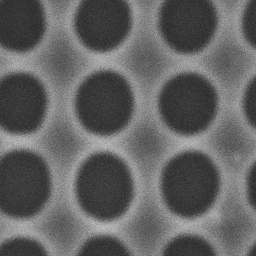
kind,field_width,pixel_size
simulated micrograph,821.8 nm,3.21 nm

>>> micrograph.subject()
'holes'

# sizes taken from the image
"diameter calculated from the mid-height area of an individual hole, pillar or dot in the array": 212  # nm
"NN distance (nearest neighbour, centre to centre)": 81.8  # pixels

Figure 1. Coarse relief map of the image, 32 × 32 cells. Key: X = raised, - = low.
-----XXXXX------XXXX-------XXXX-
------XXX--------XXX-------XXX--
------XXX--------XXX-------XXX--
------XXX--------XXX-------XXX--
------XXX-------XXXX-------XXX--
-----XXXXX-----XXXXXX-----XXXXX-
X---XXXXXXX---XXXXXXXX---XXXXXXX
XXXXXXXXXXXXXXXXXXXXXXXXXXXXXXXX
XXXXXXXXXXXXX-XXXXXXXXXXXXXXXXXX
-----XXXXXX-----XXXXX-----XXXXXX
------XXXX------XXXX-------XXXX-
------XXX--------XXX-------XXX--
------XXX--------XXX-------XXX--
------XXX--------XXX-------XXX--
------XXX--------XXX-------XXX--
-----XXXXX------XXXX------XXXXX-
-----XXXXXX----XXXXXX-----XXXXXX
XXXXXXXXXXXXXXXXXXXXXXXXXXXXXXXX
XX-XXXXXXXXXXXXXXXXXXXXXXXXXXXXX
-----XXXXXX----XXXXXXX----XXXXXX
------XXXX------XXXXX------XXXXX
------XXX--------XXX--------XXX-
-------XX--------XXX--------XXX-
-------XX--------XXX--------XXX-
------XXX--------XXX-------XXXX-
------XXXX-------XXXX------XXXX-
-----XXXXX------XXXXX-----XXXXXX
XXXXXXXXXXXX---XXXXXXXX-XXXXXXXX
XXXXXXXXXXXXXXXXXXXXXXXXXXXXXXXX
XX-XXXXXXXXX--XXXXXXXX---XXXXXXX
-----XXXXX------XXXXX-----XXXXXX
------XXXX------XXXX-------XXXX-